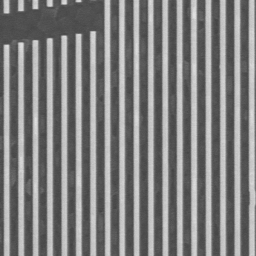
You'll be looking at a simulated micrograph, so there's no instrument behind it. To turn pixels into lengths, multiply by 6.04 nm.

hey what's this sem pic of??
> parallel lines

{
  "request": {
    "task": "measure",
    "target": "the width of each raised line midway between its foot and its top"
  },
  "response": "5.63 pixels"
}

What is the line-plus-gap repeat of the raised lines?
87.2 nm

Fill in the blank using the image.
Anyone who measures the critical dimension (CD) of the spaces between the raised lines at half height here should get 54.4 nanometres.